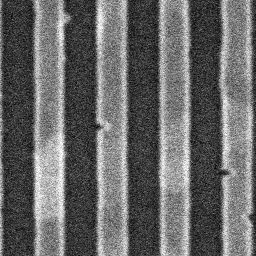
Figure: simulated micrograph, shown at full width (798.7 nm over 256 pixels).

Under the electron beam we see one or a few lines or trenches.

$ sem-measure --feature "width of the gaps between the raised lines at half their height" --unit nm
118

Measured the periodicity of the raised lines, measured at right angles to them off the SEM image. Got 195 nm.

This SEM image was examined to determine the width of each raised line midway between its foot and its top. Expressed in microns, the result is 0.0776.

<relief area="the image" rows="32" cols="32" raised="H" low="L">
LLLLLHHHLLLLHHHLLLLLHHHLLLLLHHHL
LLLLLHHHLLLLHHHLLLLLHHHLLLLLHHHL
LLLLLHHHLLLLHHHLLLLLHHHLLLLLHHHL
LLLLLHHHLLLLHHHLLLLLHHHLLLLLHHHL
LLLLLHHHLLLLHHHLLLLLHHHLLLLLHHHL
LLLLLHHHLLLLHHHLLLLLHHHLLLLLHHHL
LLLLLHHHLLLLLHHLLLLLHHHLLLLLHHHL
LLLLLHHHLLLLLHHLLLLLHHHLLLLLHHHL
LLLLLHHHLLLLLHHLLLLLHHHLLLLLHHHL
LLLLLHHHLLLLLHHLLLLLHHHLLLLLHHHL
LLLLLHHHLLLLLHHHLLLLHHHLLLLLHHHL
LLLLLHHHLLLLLHHHLLLLHHHLLLLLHHHL
LLLLLHHHLLLLHHHHLLLLHHHLLLLLHHHL
LLLLLHHHLLLLHHHHLLLLHHHLLLLLHHHL
LLLLLHHHLLLLHHHHLLLLHHHLLLLLHHHL
LLLLLHHHLLLLLHHHLLLLHHHLLLLLHHHL
LLLLLHHHLLLLLHHHLLLLHHHLLLLLHHHL
LLLLLHHHLLLLHHHHLLLLHHHLLLLLHHHL
LLLLLHHHLLLLHHHHLLLLHHHLLLLLHHHL
LLLLHHHHLLLLHHHHLLLLHHHLLLLLHHHL
LLLLLHHHLLLLHHHHLLLLHHHLLLLLHHHL
LLLLLHHHLLLLHHHHLLLLHHHLLLLLLHHL
LLLLLHHHLLLLLHHHLLLLHHHLLLLLHHHL
LLLLLHHHLLLLLHHHLLLLHHHLLLLLHHHL
LLLLLHHHLLLLLHHHLLLLHHHLLLLLHHHL
LLLLLHHHLLLLLHHHLLLLHHHLLLLLHHHL
LLLLLHHHLLLLHHHHLLLLHHHLLLLLHHHL
LLLLLHHHLLLLHHHHLLLLHHHLLLLLHHHL
LLLLLHHHLLLLHHHHLLLLHHHLLLLLHHHL
LLLLLHHHLLLLHHHHLLLLHHHLLLLLHHHL
LLLLLHHHLLLLHHHHLLLLHHHLLLLLHHHL
LLLLLHHHLLLLLHHHLLLLHHHLLLLLHHHL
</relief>